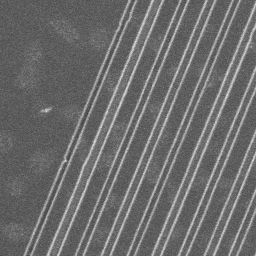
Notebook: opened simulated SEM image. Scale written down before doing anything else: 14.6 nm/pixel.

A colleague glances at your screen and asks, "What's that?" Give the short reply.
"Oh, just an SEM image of parallel lines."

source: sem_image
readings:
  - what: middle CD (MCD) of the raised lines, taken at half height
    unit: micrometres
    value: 0.241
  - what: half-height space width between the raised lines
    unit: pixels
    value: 6.71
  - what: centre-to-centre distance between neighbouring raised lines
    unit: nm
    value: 352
